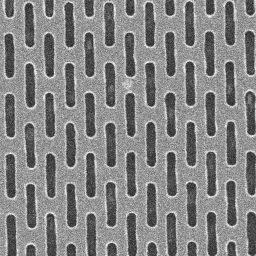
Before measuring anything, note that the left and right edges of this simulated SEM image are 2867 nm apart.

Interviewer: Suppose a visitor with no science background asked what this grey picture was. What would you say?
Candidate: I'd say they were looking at a regular array of holes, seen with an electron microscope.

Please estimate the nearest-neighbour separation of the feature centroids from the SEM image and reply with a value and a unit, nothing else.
0.397 um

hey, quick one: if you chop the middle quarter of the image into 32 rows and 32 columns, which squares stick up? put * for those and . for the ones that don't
..***...**...**...**...***..**..
...**...**...**...**...**...**..
...**...**...***..**...***..**..
...*******...********..*******..
...*******...********..*******..
...*******...*******...*******..
...*******...*******...*******..
...**..***...***.***...***..**..
...**...**...**...***..**...**..
...**...**...**...***..**...**..
*..**...***.***...***..**...***.
*****...*******...*******...****
*****...*******...*******...****
*****...*******...********..****
*****...*******...********..***.
*..**...**...**...***..***..**..
...**...**...***..**...***..***.
...**...**...***..**...***..**..
...*******...*******...*******..
...*******...*******...*******..
...*******...*******...*******..
...*******...*******...*******..
...***.***...***..**...***..**..
...**...**...**...**...***..**..
...***..***..**...**...***..***.
*.****..***..**...***..***..***.
*****...*******...********..****
*****...********..********..****
*****...********..********..****
*****...***.****..********..****
...**...***..***..***..***..***.
*..**...**...***..***..***..***.